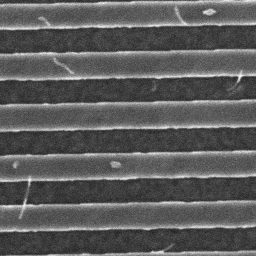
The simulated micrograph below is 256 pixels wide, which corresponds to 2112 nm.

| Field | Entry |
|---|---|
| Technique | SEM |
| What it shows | lines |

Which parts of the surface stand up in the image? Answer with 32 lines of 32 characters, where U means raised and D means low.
DDDDDDUUUUUUUUUUUUUUUUUUUUUUUUUU
UUUUUUUUUUUUUUUUUUUUUUUUUUUUUUUU
UUUUUUUUUUUUUUUUUUUUUUUUUUUUUUUU
UUUUUUUUUUDDDDDDDDDDDDDDDDDDDDDD
DDDDDDDDDDDDDDDDDDDDDDDDDDDDDDDD
DDDDDDDDDDDDDDDDDDDDDDDDDDDDDDDD
DDDDDDDDDDDDDDUUUUUUUUUUUUUUUUUU
UUUUUUUUUUUUUUUUUUUUUUUUUUUUUUUU
UUUUUUUUUUUUUUUUUUUUUUUUUUUUUUUU
UUUUUUUUUUUUUUUUUUUUUUUUUUUDUUUD
DDDDDDDDDDDDDDDDDDDDDDDDDDDDDDDD
DDDDDDDDDDDDDDDDDDDDDDDDDDDDDDDD
DDDDDDDDDDDDDDDDDDDDDDDDDDDDDDDD
UUUUUUUUUUUUUUUUUUUUUUUUUUUUUUUU
UUUUUUUUUUUUUUUUUUUUUUUUUUUUUUUU
UUUUUUUUUUUUUUUUUUUUUUUUUUUUUUUU
DDDDDDDDDDDDDDDDDDDDDDDDDDDDDDDD
DDDDDDDDDDDDDDDDDDDDDDDDDDDDDDDD
DDDDDDDDDDDDDDDDDDDDDDDDDDDDDDDD
UUUUUUUUUUUUUUUUUUUUUUUUUUUUUUUU
UUUUUUUUUUUUUUUUUUUUUUUUUUUUUUUU
UUUUUUUUUUUUUUUUUUUUUUUUUUUUUUUU
UUUUUUUUUUDDDDDDDDDDDDDDDDDDDDDD
DDDDDDDDDDDDDDDDDDDDDDDDDDDDDDDD
DDDDDDDDDDDDDDDDDDDDDDDDDDDDDDDD
DDDUDDDDDDUUUUUUUUUUUUUUUUUUUUUU
UUUUUUUUUUUUUUUUUUUUUUUUUUUUUUUU
UUUUUUUUUUUUUUUUUUUUUUUUUUUUUUUU
UUUUUUUUUUUUUUUUUUUUDDUDDDDDDDDD
DDDDDDDDDDDDDDDDDDDDDDDDDDDDDDDD
DDDDDDDDDDDDDDDDDDDDDDDDDDDDDDDD
DDDDDDDDDDDDDDDDDDDUDDDDDDDDDUUU